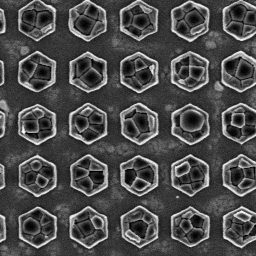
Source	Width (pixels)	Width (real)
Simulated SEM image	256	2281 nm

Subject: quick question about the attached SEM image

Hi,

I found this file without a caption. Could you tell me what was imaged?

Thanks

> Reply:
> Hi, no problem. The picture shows a regular array of raised bodies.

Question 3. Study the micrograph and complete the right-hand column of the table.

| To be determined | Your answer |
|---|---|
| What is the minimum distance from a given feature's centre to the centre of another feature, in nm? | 453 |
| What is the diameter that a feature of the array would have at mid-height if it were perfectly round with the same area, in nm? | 335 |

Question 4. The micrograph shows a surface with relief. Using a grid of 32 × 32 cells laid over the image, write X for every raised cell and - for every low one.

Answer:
----XX----XX----XX-----XX----XX-
--XXXXX--XXXX--XXXXX--XXXX--XXXX
X-XXXXX--XXXX--XXXXX--XXXX--XXXX
X-XXXXX--XXXX--XXXXX--XXXX--XXXX
---XXX----XX----XX-----XX----XX-
--------------------------------
--------------------------------
---XXXX--XXXX--XXXX---XXXX--XXXX
--XXXXX--XXXX--XXXXX-XXXXX--XXXX
--XXXXX--XXXX--XXXXX--XXXX--XXXX
---XXX---XXXX---XXX---XXX---XXXX
--------------------------------
--------------------------------
----XX----XX----XX-----XX----XX-
--XXXXX--XXXX--XXXXX--XXXX--XXXX
--XXXXX--XXXX--XXXXX--XXXX--XXXX
--XXXXX--XXXX--XXXXX--XXXX--XXXX
----XX----XX----XX-----XX----XX-
--------------------------------
------------------------------X-
---XXX---XXXX--XXXX---XXXX--XXXX
X-XXXXX--XXXX--XXXXX--XXXX--XXXX
X-XXXXX--XXXX--XXXXX--XXXX--XXXX
---XXXX--XXXX---XXX---XXX----XXX
--------------------------------
--------------------------------
----XX----XX----XXX----XX----XX-
X-XXXXX--XXXX--XXXXX--XXXX--XXXX
X--XXXX--XXXX--XXXXX--XXXX--XXXX
X--XXXX--XXXX--XXXXX--XXXX--XXXX
----X-----XX-----X-----XX----XX-
--------------------------------